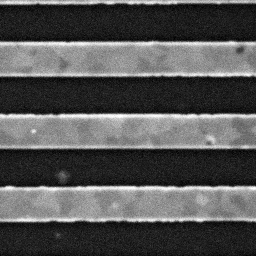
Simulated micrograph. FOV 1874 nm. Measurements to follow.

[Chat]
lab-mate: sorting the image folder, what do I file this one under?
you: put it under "lines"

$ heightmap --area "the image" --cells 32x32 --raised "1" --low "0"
00000000000000000000000000000000
00000000000000000000000000000000
00000000000000000000000000000000
00000000000000000000000000000000
00000000000000000000000000000000
11111111111111111111111111111111
11111111111111111111111111111111
11111111111111111111111111111111
11111111111111111111111111111111
00000000000000000000000000000000
00000000000000000000000000000000
00000000000000000000000000000000
00000000000000000000000000000000
00000000000000000000000000000000
11111111111111111111111111111111
11111111111111111111111111111111
11111111111111111111111111111111
11111111111111111111111111111111
00000000000000000000000000000000
00000000000000000000000000000000
00000000000000000000000000000000
00000000000000000000000000000000
00000000000000000000000000000000
01000100000111111011000110011111
11111111111111111111111111111111
11111111111111111111111111111111
11111111111111111111111111111111
11111111110111101111111011000001
00000000000000000000000000000000
00000000000000000000000000000000
00000000000000000000000000000000
00000000000000000000000000000000